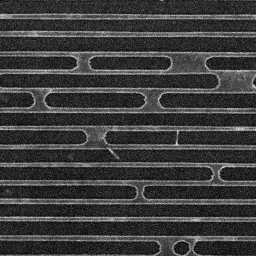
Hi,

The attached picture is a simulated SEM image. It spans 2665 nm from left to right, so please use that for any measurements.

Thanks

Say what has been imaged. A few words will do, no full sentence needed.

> parallel lines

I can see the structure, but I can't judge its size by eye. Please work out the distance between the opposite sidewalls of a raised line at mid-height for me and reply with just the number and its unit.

48.2 nm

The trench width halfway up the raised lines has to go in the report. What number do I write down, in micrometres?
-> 0.146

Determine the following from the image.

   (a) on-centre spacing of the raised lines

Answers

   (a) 0.192 micrometres